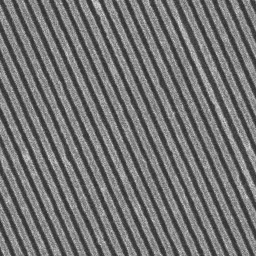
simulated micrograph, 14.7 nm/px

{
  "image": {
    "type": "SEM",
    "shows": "parallel lines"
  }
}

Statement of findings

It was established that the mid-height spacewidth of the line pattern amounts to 0.0736 microns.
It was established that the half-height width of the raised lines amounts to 5.93 pixels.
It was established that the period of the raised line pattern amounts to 0.168 microns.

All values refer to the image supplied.